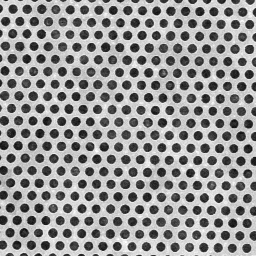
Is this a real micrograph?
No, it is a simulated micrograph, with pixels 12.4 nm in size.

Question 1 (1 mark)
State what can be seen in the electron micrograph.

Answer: a regular array of holes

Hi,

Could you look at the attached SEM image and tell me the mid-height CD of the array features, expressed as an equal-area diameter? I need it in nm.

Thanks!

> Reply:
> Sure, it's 124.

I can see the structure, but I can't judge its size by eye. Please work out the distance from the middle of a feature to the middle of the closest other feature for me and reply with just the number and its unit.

176 nanometres